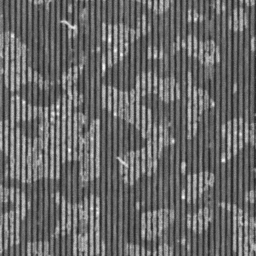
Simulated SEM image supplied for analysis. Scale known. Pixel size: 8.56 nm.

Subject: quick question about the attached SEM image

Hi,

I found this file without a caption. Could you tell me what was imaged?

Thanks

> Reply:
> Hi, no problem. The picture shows parallel lines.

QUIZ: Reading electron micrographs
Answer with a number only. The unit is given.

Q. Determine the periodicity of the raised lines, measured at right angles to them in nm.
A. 48.9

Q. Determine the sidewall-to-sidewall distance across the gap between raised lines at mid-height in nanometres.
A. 24.6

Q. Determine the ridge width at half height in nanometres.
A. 25.7